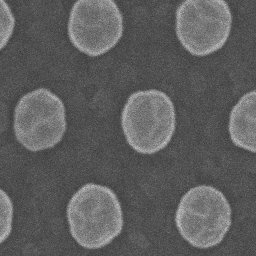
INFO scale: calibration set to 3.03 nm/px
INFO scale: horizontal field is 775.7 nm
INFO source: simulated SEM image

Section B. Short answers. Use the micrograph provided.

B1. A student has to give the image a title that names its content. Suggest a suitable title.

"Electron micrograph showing raised bodies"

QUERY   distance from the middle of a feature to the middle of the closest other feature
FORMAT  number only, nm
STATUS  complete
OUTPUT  330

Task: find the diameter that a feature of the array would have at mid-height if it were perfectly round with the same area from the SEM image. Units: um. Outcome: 0.174